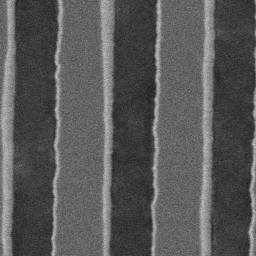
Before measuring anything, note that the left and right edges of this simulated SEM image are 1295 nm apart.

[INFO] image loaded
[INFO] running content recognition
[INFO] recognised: lines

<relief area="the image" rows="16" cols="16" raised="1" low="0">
1000111000111000
1000111000111000
1000111000111000
1001111000111000
1000111000111000
1000111000111000
1000111000111000
1000111000111000
1001111000111000
1001111000111000
1000111000111000
1001111000111000
1001111000111000
1001111001111000
1001111000111000
1001111001111000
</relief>